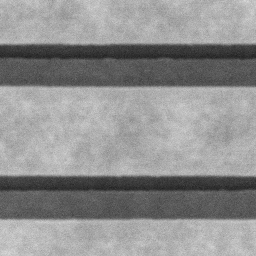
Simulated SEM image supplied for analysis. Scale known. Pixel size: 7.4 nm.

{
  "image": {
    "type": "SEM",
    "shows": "lines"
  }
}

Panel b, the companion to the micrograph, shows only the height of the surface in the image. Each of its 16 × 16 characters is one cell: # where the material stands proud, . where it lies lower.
################
################
################
................
................
################
################
################
################
################
################
................
................
................
################
################